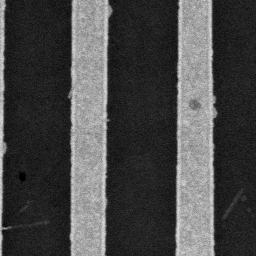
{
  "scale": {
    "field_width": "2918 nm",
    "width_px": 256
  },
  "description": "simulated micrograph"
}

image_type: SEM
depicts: lines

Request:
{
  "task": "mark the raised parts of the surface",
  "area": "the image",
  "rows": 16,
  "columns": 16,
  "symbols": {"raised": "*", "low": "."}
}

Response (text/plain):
.....**....**...
.....**....**...
.....**....**...
.....**....**...
.....**....**...
....***....**...
....***....**...
....***....**...
....***....**...
....***....**...
....***....**...
....***....**...
....***....**...
....***....**...
....***....**...
....**.....**...